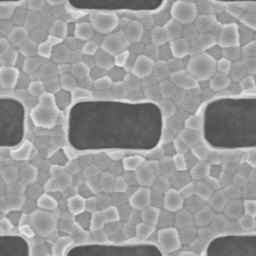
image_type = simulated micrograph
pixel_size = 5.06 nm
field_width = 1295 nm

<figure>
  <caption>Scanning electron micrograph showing holes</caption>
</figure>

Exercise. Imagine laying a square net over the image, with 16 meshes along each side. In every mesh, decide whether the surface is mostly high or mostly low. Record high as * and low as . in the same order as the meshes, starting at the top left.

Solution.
*****.....******
****************
****************
****************
****************
****************
.****....****...
.***......***...
.***......***...
****************
****************
****************
****************
****************
****************
..***.....***...